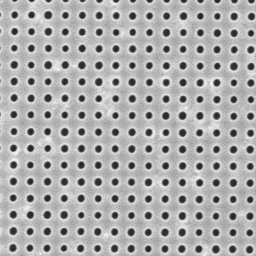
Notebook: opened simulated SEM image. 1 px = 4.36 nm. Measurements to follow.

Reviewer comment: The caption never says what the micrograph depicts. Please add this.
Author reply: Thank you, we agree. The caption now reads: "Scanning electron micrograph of a regular array of holes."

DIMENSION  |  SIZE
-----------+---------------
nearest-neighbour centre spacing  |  0.0717 microns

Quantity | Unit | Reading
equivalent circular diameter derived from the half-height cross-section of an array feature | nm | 31.1